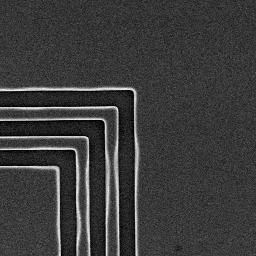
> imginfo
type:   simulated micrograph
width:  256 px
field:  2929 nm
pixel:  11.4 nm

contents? groups of lines, slits or small figures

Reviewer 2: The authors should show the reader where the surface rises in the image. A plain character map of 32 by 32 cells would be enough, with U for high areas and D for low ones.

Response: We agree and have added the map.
UUUUUUUUUUUUUUUUUUUUUUUUUUUUUUUU
UUUUUUUUUUUUUUUUUUUUUUUUUUUUUUUU
UUUUUUUUUUUUUUUUUUUUUUUUUUUUUUUU
UUUUUUUUUUUUUUUUUUUUUUUUUUUUUUUU
UUUUUUUUUUUUUUUUUUUUUUUUUUUUUUUU
UUUUUUUUUUUUUUUUUUUUUUUUUUUUUUUU
UUUUUUUUUUUUUUUUUUUUUUUUUUUUUUUU
UUUUUUUUUUUUUUUUUUUUUUUUUUUUUUUU
UUUUUUUUUUUUUUUUUUUUUUUUUUUUUUUU
UUUUUUUUUUUUUUUUUUUUUUUUUUUUUUUU
UUUUUUUUUUUUUUUUUUUUUUUUUUUUUUUU
DDDDDDDDDDDDDDDDDUUUUUUUUUUUUUUU
DDDDDDDDDDDDDDDDDUUUUUUUUUUUUUUU
UUDDDUUUUUUUUUDDDUUUUUUUUUUUUUUU
UUUUUUUUUUUUUUUDDUUUUUUUUUUUUUUU
DDDDDDDDDDDDDUUDDUUUUUUUUUUUUUUU
DDDDDDDDDDDDDUUDDUUUUUUUUUUUUUUU
UUUUUUUUUUUDDUUDDUUUUUUUUUUUUUUU
UUUUUUUUUUUDDUUDDUUUUUUUUUUUUUUU
DDDDDDDDDUUDDUUDDUUUUUUUUUUUUUUU
DDDDDDDDDDUDDUUDDUUUUUUUUUUUUUUU
UUUUUUUDDDUDDUUDDUUUUUUUUUUUUUUU
UUUUUUUDDDUDDUUDDUUUUUUUUUUUUUUU
UUUUUUUDDDUDDUUDDUUUUUUUUUUUUUUU
UUUUUUUDDDUDDUUDDUUUUUUUUUUUUUUU
UUUUUUUDDDUDDUUDDUUUUUUUUUUUUUUU
UUUUUUUDDDUDDUUDDUUUUUUUUUUUUUUU
UUUUUUUDDDUDDUUDDUUUUUUUUUUUUUUU
UUUUUUUDDDUDDUUDDUUUUUUUUUUUUUUU
UUUUUUUDDDUDDUUDDUUUUUUUUUUUUUUU
UUUUUUUDDDUDDUUDDUUUUUUUUUUUUUUU
UUUUUUUDDDUDDUUDDUUUUUUUUUUUUUUU